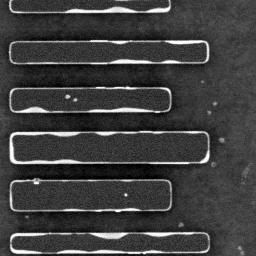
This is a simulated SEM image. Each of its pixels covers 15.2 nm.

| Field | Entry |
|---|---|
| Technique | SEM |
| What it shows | groups of lines, slits or small figures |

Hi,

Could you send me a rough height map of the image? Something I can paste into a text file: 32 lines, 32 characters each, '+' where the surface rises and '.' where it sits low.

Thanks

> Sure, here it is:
.++++++++++++++++++++...........
..+++...........................
................................
................................
................................
..++++++++++++++++++++++++......
.+++++++++++++++++++++++++......
.+++++++++++++++++++++++++......
................................
................................
................................
..+++++++++++++++++++...........
.++++++++++++++++++++...........
.++++++++++++++++++++...........
................................
................................
................................
.+++++++++++++++++++++++++......
.+++++++++++++++++++++++++......
..++++++++++++++++++++++++......
................................
................................
....+.............+++...........
.++++++++++++++++++++...........
.++++++++++++++++++++...........
.++++++++++++++++++++...........
................................
................................
................................
..++++++++++++++++++++++++......
.+++++++++++++++++++++++++......
...+++++..++...+++..+++++.......